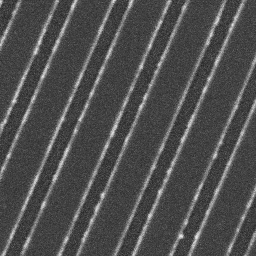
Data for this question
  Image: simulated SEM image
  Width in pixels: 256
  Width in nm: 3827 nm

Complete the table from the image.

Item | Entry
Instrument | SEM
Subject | parallel lines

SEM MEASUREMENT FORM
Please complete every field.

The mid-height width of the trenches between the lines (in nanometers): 228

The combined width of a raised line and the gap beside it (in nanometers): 768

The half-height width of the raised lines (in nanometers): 542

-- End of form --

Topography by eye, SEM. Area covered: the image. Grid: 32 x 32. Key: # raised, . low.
..#####..#####..#####..#####..##
..#####..#####..#####..#####..##
.#####..#####..#####..#####..###
.#####..#####..#####..#####..###
#####...####...####..#####..####
#####..#####..#####..#####..####
#####..####...####...#####..####
####..#####..#####..#####..#####
####..#####..#####..#####..#####
###..#####..#####..#####..#####.
###..#####..#####..#####..#####.
##..#####..#####..#####..#####..
##..#####..#####..#####..#####..
#...####...####..#####...#####..
#..#####..#####..#####..#####..#
#..#####..#####..#####..#####..#
..#####..#####..#####..#####..##
..#####..#####..#####..#####..##
.#####..#####..#####..#####..###
.#####..#####..#####..#####..###
.####...####...####...####..####
#####..#####..#####..#####..####
#####..#####..#####..#####..####
####..#####..#####..#####..#####
####..#####..#####..#####..#####
###..#####..#####..#####..#####.
###..#####..#####..#####..#####.
##...####..#####..#####...####..
##..#####..#####..#####..#####..
##..#####..#####..#####..#####..
#..#####..#####..#####..#####..#
#..#####..#####..#####..#####..#